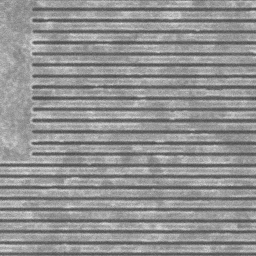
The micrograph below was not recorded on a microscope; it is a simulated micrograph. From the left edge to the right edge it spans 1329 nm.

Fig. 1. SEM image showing parallel lines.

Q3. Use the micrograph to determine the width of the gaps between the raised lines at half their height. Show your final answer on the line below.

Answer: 0.0247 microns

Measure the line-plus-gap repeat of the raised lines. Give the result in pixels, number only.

11.1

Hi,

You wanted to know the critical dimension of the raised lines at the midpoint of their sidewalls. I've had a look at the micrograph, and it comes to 35 nanometres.